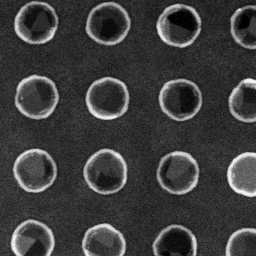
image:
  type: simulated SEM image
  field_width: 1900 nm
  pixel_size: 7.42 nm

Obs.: a regular array of raised bodies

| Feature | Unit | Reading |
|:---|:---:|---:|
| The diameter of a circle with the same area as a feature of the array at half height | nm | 302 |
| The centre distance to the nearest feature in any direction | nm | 527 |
